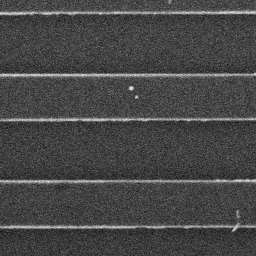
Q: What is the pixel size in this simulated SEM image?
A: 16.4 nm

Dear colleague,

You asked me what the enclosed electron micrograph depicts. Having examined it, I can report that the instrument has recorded lines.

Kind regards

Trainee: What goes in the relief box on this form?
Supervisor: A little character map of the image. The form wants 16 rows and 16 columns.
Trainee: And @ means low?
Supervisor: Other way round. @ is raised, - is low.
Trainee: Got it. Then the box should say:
@@@@@@@@@@@@@@@@
----------------
----------------
----------------
----------------
@@@@@@@@@@@@@@@@
@@@@@@@@@@@@@@@@
@@@@@@@@@@-@@---
----------------
----------------
----------------
@@@@@@@@@@@@@@@@
@@@@@@@@@@@@@@@@
@@@@@@@@@@@@@@@@
----------------
----------------